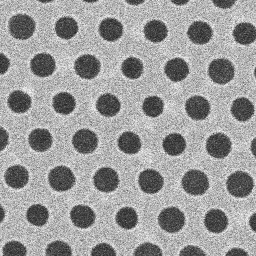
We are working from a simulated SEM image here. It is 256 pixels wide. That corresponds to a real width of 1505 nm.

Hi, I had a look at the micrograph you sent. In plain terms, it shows a regular array of holes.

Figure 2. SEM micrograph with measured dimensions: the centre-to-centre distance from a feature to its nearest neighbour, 256 nanometers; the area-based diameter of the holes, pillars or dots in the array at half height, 148 nanometres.